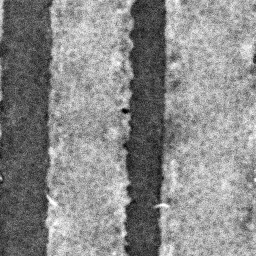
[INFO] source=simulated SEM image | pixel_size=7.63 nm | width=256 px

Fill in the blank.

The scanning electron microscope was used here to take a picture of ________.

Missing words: one or a few lines or trenches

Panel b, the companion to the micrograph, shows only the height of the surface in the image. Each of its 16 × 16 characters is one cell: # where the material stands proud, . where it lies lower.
...#####...#####
...#####...#####
...#####...#####
...#####...#####
...#####..######
...#####...#####
...#####..######
...#####..######
...#####..######
...#####..######
...#####..######
...#####..######
...#####..######
...#####..######
...#####..######
...#####..######